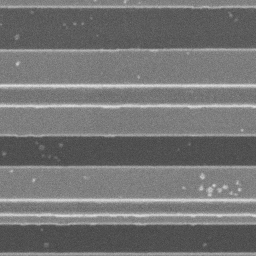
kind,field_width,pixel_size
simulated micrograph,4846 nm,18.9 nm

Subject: lines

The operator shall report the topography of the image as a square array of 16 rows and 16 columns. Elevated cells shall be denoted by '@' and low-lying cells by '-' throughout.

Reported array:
----------------
----------------
----------------
@@@@@@@@@@@@@@@@
@@@@@@@@@@@@@@@@
@@@@@@@@@@@@@@@@
@@@@@@@@@@@@@@@@
@@@@@@@@@@@@@@@@
----------------
----------------
@@@@@@@@@@@@@@@@
@@@@@@@@@@@@@@@@
@@@@@@@@@@@@@@@@
@@@@@@@@@@@@@@@@
----------------
----------------